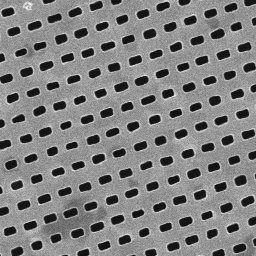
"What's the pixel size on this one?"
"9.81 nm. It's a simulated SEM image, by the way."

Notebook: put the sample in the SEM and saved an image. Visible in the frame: a regular array of holes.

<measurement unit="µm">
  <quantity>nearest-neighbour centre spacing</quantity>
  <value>0.201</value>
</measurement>